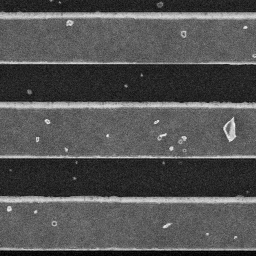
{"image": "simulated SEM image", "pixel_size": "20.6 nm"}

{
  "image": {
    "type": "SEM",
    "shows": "lines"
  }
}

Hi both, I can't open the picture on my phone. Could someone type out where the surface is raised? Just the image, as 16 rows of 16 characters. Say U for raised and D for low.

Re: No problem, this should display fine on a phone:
DDDDDDDDDDDDDDDD
UUUUUUUUUUUUUUUU
UUUUUUUUUUUUUUUU
UUUUUUUUUUUUUUUU
DDDDDDDDDDDDDDDD
DDDDDDDDDDDDDDDD
UDDDDDDUDDDDUDDD
UUUUUUUUUUUUUUUU
UUUUUUUUUUUUUUUU
UUUUUUUUUUUUUUUU
DDDDDDDDDDDDDDDD
DDDDDDDDDDDDDDDD
UUUUUUUUUUUUUUUU
UUUUUUUUUUUUUUUU
UUUUUUUUUUUUUUUU
UUUUUUUUUUUUUUUU